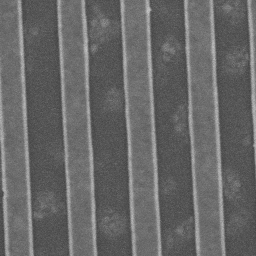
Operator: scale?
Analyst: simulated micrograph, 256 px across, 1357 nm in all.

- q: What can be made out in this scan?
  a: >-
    one or a few lines or trenches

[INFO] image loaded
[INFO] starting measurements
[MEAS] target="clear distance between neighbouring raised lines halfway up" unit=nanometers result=202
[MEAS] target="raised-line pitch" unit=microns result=0.337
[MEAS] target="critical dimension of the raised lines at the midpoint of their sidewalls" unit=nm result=138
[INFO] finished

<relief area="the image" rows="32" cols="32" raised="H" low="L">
HHLLLLLHHHLLLLLHHHLLLLLHHHLLLLLH
HHLLLLLHHHLLLLLHHHHLLLLHHHLLLLLH
HHHLLLLHHHHLLLLHHHHLLLLHHHHLLLLH
HHHLLLLHHHHLLLLHHHHLLLLHHHHLLLLH
HHHLLLLHHHHLLLLHHHHLLLLHHHHLLLLH
HHHLLLLLHHHLLLLHHHHLLLLHHHHLLLLL
HHHLLLLLHHHLLLLLHHHLLLLHHHHLLLLH
HHHLLLLLHHHLLLLLHHHLLLLHHHHLLLLL
HHHLLLLLHHHLLLLLHHHLLLLLHHHLLLLL
HHHLLLLLHHHLLLLLHHHLLLLLHHHLLLLL
HHHLLLLLHHHLLLLLHHHLLLLLHHHLLLLL
HHHLLLLLHHHLLLLLHHHLLLLLHHHLLLLL
HHHLLLLLHHHLLLLLHHHLLLLLHHHLLLLL
HHHLLLLLHHHLLLLLHHHLLLLLHHHLLLLL
HHHLLLLLHHHLLLLLHHHLLLLLHHHLLLLL
HHHLLLLLHHHLLLLLHHHLLLLLHHHLLLLL
HHHLLLLLHHHLLLLLHHHLLLLLHHHLLLLL
HHHLLLLLHHHLLLLLHHHLLLLLHHHLLLLL
HHHLLLLLHHHLLLLLHHHLLLLLHHHLLLLL
HHHLLLLLHHHLLLLLHHHLLLLLHHHLLLLL
HHHLLLLLHHHLLLLLHHHLLLLLHHHLLLLL
LHHLLLLLHHHLLLLLHHHLLLLLHHHLLLLL
HHHHLLLLHHHHLLLLHHHLLLLLHHHHLLLL
HHHHLLLLLHHHLLLLHHHHLLLLHHHHLLLL
LHHHLLLLLHHHLLLLHHHHLLLLHHHHLLLL
LHHHLLLLLHHHLLLLHHHHLLLLHHHHLLLL
LHHHLLLLLHHHLLLLHHHHLLLLLHHHLLLL
LHHHLLLLLHHHLLLLLHHHLLLLLHHHLLLL
LHHHLLLLLHHHLLLLLHHHLLLLLHHHLLLL
LHHHLLLLLHHHLLLLLHHHLLLLLHHHLLLL
LHHHLLLLLHHHLLLLLHHHLLLLLHHHLLLL
LHHHLLLLLHHHLLLLLHHHLLLLLHHHLLLL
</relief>